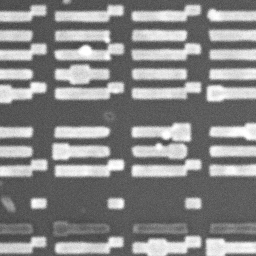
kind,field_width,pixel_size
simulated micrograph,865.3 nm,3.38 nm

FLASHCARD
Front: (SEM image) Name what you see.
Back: wiring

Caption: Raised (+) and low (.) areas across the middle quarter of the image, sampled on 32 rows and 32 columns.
................................
.++++++.........................
+++++++++++......+++++++++++++..
+++++++++++.......++++++++++++..
..++++..........................
...........++++................+
+++++++++++++++..+++++++++++++++
+++++++++++......+++++++++++++..
+++++++++.......................
................................
................................
................................
................................
................................
................................
...........................++++.
+++++++++++......++++++++++++++.
+++++++++++......++++++++++++++.
.........................+.++++.
................................
+......................++.++++..
+++++++++++......+++++++++++++..
+++++++++++.......++++++++++++..
+...............................
...........++++................+
...........++++...............++
++++++++++++.....++++++++++++++.
+++++++++++......+++++++++++++..
................................
................................
................................
................................